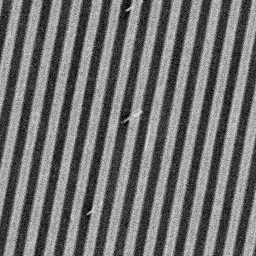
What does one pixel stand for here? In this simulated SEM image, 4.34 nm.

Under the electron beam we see parallel lines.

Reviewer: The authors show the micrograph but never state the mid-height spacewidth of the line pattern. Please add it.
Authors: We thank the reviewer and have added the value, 44.2 nanometres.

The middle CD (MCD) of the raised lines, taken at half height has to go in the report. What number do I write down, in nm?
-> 39.9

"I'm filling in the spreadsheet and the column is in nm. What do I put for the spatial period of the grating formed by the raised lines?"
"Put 84.8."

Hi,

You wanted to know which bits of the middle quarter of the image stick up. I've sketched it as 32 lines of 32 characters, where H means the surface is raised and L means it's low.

HLLLHHLLLHHLLLHHLLLHHLLLHHLLLHHL
HLLLHHLLLHHLLLHHLLLHHLLLHHLLLHHL
HLLLHHLLHHHLLLHHLLLHHLLLHHLLLHHL
HLLHHHLLHHHLLHHHLLHHHLLLHHLLHHHL
LLLHHLLLHHHLLHHLLLHHHLLHHHLLHHLL
LLLHHLLLHHLLLHHLLLHHLLLHHLLLHHLL
LLLHHLLLHHLLLHHLLLHHLLLHHLLLHHLL
LLLHHLLLHHLLLHHLLLHHLLLHHLLLHHLL
LLHHHLLLHHLLHHHLLHHHLLLHHLLHHHLL
LLHHHLLHHHLLHHHLLHHLLLHHHLLHHHLL
LLHHLLLHHLLLHHLLLHHLLLHHLLLHHLLL
LLHHLLLHHLLLHHLLLHHLLLHHLLLHHLLL
LLHHLLLHHLLLHHLLLHHLLLHHLLLHHLLL
LHHHLLLHHLLLHHLLHHHLLLHHLLLHHLLL
LHHHLLHHHLLHHHLLHHHLLHHHLLHHHLLH
LHHHLLHHLLLHHLLLHHHLLHHLLLHHLLLH
LHHLLLHHLLLHHLLLHHLLLHHLLLHHLLLH
LHHLLLHHLLLHHLLLHHLLLHHLLLHHLLLH
LHHLLLHHLLLHHLLLHHLLHHHLLLHHLLHH
LHHLLHHHLLHHHLLLHHLLHHHLLHHHLLHH
HHLLLHHLLLHHLLLHHHLLHHLLLHHLLLHH
HHLLLHHLLLHHLLLHHLLLHHLLLHHLLLHH
HHLLLHHLLLHHLLLHHLLLHHLLLHHLLLHH
HHLLLHHLLLHHLLLHHLLLHHLLLHHLLLHH
HHLLHHHLLHHHLLLHHLLHHHLLHHHLLHHH
HLLLHHHLLHHLLLHHHLLHHHLLHHLLLHHH
HLLLHHLLLHHLLLHHLLLHHLLLHHLLLHHL
HLLLHHLLLHHLLLHHLLLHHLLLHHLLLHHL
HLLLHHLLLHHLLLHHLLLHHLLLHHLLLHHL
HLLLHHLLHHHLLLHHLLLHHLLHHHLLHHHL
LLLHHHLLHHLLLHHHLLHHHLLHHLLLHHLL
LLLHHLLLHHLLLHHLLLHHLLLHHLLLHHLL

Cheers